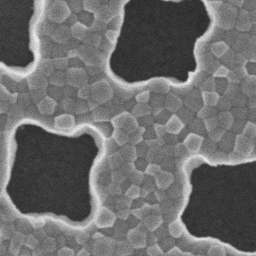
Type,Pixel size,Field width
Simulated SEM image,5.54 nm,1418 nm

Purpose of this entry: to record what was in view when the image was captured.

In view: holes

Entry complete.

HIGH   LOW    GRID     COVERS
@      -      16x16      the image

--@@@@@@-----@@@
--@@@@@@-----@@@
--@@@@@-----@@@@
--@@@@@-----@@@@
@@@@@@@-----@@@@
@@@@@@@@@@@@@@@@
@@@@@@@@@@@@@@@@
@@@@@@@@@@@@@@@@
@-----@@@@@@@@@@
@-----@@@@@@@@@@
@-----@@@@@@----
------@@@@@@----
@-----@@@@@@----
@@@---@@@@@-----
@@@@@@@@@@@@----
@@@@@@@@@@@@@@@-